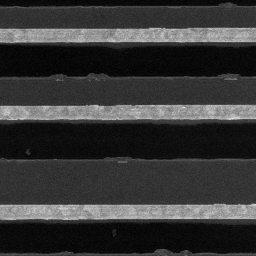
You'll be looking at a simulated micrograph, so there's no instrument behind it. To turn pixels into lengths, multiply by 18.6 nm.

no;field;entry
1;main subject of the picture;lines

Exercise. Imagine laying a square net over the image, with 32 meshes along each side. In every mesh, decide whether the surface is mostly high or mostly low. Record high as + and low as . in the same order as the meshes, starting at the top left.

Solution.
............................+...
++++++++++++++++++++++++++++++++
++++++++++++++++++++++++++++++++
++++++++++++++++++++++++++++++++
++++++++++++++++++++++++++++++++
................................
................................
................................
................................
......++...++..............+++..
++++++++++++++++++++++++++++++++
++++++++++++++++++++++++++++++++
++++++++++++++++++++++++++++++++
++++++++++++++++++++++++++++++++
++++++++++++++++++++++++++++++++
................................
................................
................................
................................
................................
++++++++++++++++++++++++++++++++
++++++++++++++++++++++++++++++++
++++++++++++++++++++++++++++++++
++++++++++++++++++++++++++++++++
++++++++++++++++++++++++++++++++
++++++++++++++++++++++++++++++++
++++++++++++++++++++++++++++++++
................................
................................
................................
................................
........+..........++..+........